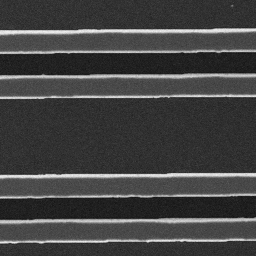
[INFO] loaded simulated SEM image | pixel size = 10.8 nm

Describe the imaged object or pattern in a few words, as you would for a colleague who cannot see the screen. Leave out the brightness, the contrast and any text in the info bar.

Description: lines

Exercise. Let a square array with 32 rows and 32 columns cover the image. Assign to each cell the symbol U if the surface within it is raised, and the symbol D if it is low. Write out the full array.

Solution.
DDDDDDDDDDDDDDDDDDDDDDDDDDDDDDDD
DDDDDDDDDDDDDDDDDDDDDDDDDDDDDDDD
DDDDDDDDDDDDDDDDDDDDDDDDDDDDDDDD
DDDDDDDDDDDDDDDDDDDDDDDDDDDDDDDD
UUUUUUUUUUUUUUUUUUUUUUUUUUUUUUUU
UUUUUUUUUUUUUUUUUUUUUUUUUUUUUUUU
UUUUUUUUUUUUUUUUUUUUUUUUDDDDDDDD
DDDDDDDDDDDDDDDDDDDDDDDDDDDDDDDD
DDDDDDDDDDDDDDDDDDDDDDDDDDDDDDDD
DDUUUUUUUUUUUUUUUUUUUUUUUUUUUUUU
UUUUUUUUUUUUUUUUUUUUUUUUUUUUUUUU
UUUUUUUUUUUUUUUUUUUUUUUUUUUUUUUU
DDDDDDDDDDDDDDDDDDDDDDDDDDDDDDDD
DDDDDDDDDDDDDDDDDDDDDDDDDDDDDDDD
DDDDDDDDDDDDDDDDDDDDDDDDDDDDDDDD
DDDDDDDDDDDDDDDDDDDDDDDDDDDDDDDD
DDDDDDDDDDDDDDDDDDDDDDDDDDDDDDDD
DDDDDDDDDDDDDDDDDDDDDDDDDDDDDDDD
DDDDDDDDDDDDDDDDDDDDDDDDDDDDDDDD
DDDDDDDDDDDDDDDDDDDDDDDDDDDDDDDD
DDDDDDDDDDDDDDDDDDDDDDDDDDDDDDDD
DDDDDDDDDDDDDDDDDDDDDDDDDDDDDDDD
UUUUUUUUUUUUUUUUUUUUUUUUUUUUUUUU
UUUUUUUUUUUUUUUUUUUUUUUUUUUUUUUU
UUUUUUUUUUUUUUUUUUUUUUUUUUUUUDDD
DDDDDDDDDDDDDDDDDDDDDDDDDDDDDDDD
DDDDDDDDDDDDDDDDDDDDDDDDDDDDDDDD
DDDDDDDDDDDDDDDUUUUUUUUUUUUUUUUU
UUUUUUUUUUUUUUUUUUUUUUUUUUUUUUUU
UUUUUUUUUUUUUUUUUUUUUUUUUUUUUUUU
DDDDDDDDDDDDDDDDDDDDDDDDDDDDDDDD
DDDDDDDDDDDDDDDDDDDDDDDDDDDDDDDD